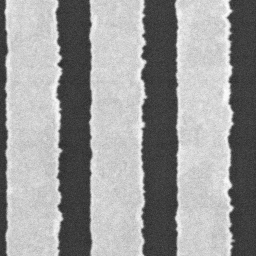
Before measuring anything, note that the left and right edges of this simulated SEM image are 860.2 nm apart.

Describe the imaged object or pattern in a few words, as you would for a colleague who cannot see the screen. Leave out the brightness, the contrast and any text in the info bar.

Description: lines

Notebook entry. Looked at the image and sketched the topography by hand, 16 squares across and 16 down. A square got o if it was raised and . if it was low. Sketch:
oooo..ooo..ooo..
oooo..ooo..ooo..
oooo..ooo..ooo..
oooo..ooo..ooo..
oooo..ooo..ooo..
oooo..ooo..ooo..
oooo..ooo..ooo..
oooo..ooo..ooo..
oooo..ooo..ooo..
oooo..ooo..ooo..
oooo..ooo..ooo..
oooo..ooo..ooo..
oooo..ooo..ooo..
oooo..ooo..ooo..
oooo..ooo..ooo..
oooo..ooo..ooo..